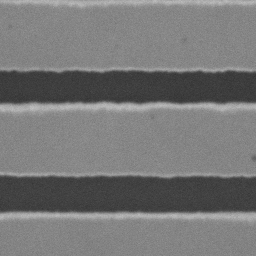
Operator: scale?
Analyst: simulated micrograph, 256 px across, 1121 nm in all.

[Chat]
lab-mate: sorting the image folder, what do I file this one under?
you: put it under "lines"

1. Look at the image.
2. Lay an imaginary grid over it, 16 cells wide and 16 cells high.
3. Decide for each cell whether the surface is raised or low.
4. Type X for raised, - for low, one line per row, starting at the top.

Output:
XXXXXXXXXXXXXXXX
XXXXXXXXXXXXXXXX
XXXXXXXXXXXXXXXX
XXXXXXXXXXXXXXXX
----------------
----------------
--X-XXXXXXXXXXXX
XXXXXXXXXXXXXXXX
XXXXXXXXXXXXXXXX
XXXXXXXXXXXXXXXX
XXXXXXXXXXXXXXXX
----------------
----------------
XXXXXXXXXXXXXXXX
XXXXXXXXXXXXXXXX
XXXXXXXXXXXXXXXX